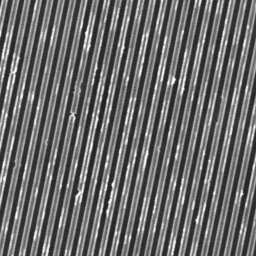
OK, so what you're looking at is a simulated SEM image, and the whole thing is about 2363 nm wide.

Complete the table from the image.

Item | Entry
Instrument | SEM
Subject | parallel lines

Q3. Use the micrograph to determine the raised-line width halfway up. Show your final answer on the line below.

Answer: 55.4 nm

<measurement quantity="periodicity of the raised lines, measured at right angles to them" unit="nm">103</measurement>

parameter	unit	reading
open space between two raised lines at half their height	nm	47.5